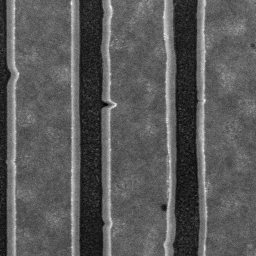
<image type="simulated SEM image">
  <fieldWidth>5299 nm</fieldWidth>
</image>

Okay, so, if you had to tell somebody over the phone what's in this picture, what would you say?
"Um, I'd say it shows one or a few lines or trenches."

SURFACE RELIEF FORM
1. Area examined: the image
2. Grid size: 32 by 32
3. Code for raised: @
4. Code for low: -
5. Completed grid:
-@@@@@@@@----@@@@@@@@----@@@@@@@
-@@@@@@@@-----@@@@@@@----@@@@@@@
-@@@@@@@@----@@@@@@@@----@@@@@@@
-@@@@@@@@----@@@@@@@@----@@@@@@@
-@@@@@@@@----@@@@@@@@----@@@@@@@
-@@@@@@@@----@@@@@@@@----@@@@@@@
-@@@@@@@@----@@@@@@@@----@@@@@@@
-@@@@@@@@----@@@@@@@@----@@@@@@@
--@@@@@@@----@@@@@@@@----@@@@@@@
--@@@@@@@----@@@@@@@@----@@@@@@@
--@@@@@@@----@@@@@@@@----@@@@@@@
--@@@@@@@----@@@@@@@@----@@@@@@@
--@@@@@@@----@@@@@@@@----@@@@@@@
--@@@@@@@-----@@@@@@@----@@@@@@@
--@@@@@@@----@@@@@@@@----@@@@@@@
--@@@@@@@----@@@@@@@@----@@@@@@@
--@@@@@@@----@@@@@@@@----@@@@@@@
--@@@@@@@----@@@@@@@@----@@@@@@@
--@@@@@@@----@@@@@@@@----@@@@@@@
-@@@@@@@@----@@@@@@@@----@@@@@@@
-@@@@@@@@----@@@@@@@@----@@@@@@@
--@@@@@@@----@@@@@@@@----@@@@@@@
-@@@@@@@@----@@@@@@@@----@@@@@@@
-@@@@@@@@----@@@@@@@@----@@@@@@@
-@@@@@@@@----@@@@@@@@----@@@@@@@
-@@@@@@@@----@@@@@@@@----@@@@@@@
-@@@@@@@@----@@@@@@@@----@@@@@@@
--@@@@@@@----@@@@@@@@-----@@@@@@
-@@@@@@@@----@@@@@@@@-----@@@@@@
-@@@@@@@@----@@@@@@@@-----@@@@@@
-@@@@@@@@----@@@@@@@@----@@@@@@@
-@@@@@@@@----@@@@@@@@----@@@@@@@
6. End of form